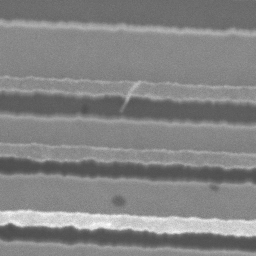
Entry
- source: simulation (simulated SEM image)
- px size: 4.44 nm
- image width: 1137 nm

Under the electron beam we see lines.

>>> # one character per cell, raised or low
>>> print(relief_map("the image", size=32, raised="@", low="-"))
--------------------------------
--------------------------------
--------------------------------
@@@@@@@@@@@@@@@@----------------
@@@@@@@@@@@@@@@@@@@@@@@@@@@@@@@@
@@@@@@@@@@@@@@@@@@@@@@@@@@@@@@@@
@@@@@@@@@@@@@@@@@@@@@@@@@@@@@@@@
@@@@@@@@@@@@@@@@@@@@@@@@@@@@@@@@
@@@@@@@@@@@@@@@@@@@@@@@@@@@@@@@@
@@@@@@@@@@@@@@@@@@@@@@@@@@@@@@@@
@@@@@@@@@@@@@@@@@@@@@@@@@@@@@@@@
---@--@@@@@@@@@@@@@@@@@@@@@@@@@@
----------------------@--@@@@@@@
--------------------------------
@@------------------------------
@@@@@@@@@@@@@@@@@@@@@@@@-@------
@@@@@@@@@@@@@@@@@@@@@@@@@@@@@@@@
@@@@@@@@@@@@@@@@@@@@@@@@@@@@@@@@
@@@@@@@@@@@@@@@@@@@@@@@@@@@@@@@@
@@@@@@@@@@@@@@@@@@@@@@@@@@@@@@@@
------------------@@@@@@@@@@@@@@
--------------------------------
@@@@@@@@@@@@@@@@@@--------------
@@@@@@@@@@@@@@@@@@@@@@@@@@@@@@@@
@@@@@@@@@@@@@@@@@@@@@@@@@@@@@@@@
@@@@@@@@@@@@@@@@@@@@@@@@@@@@@@@@
@@@@@@@@@@@@@@@@@@@@@@@@@@@@@@@@
@@@@@@@@@@@@@@@@@@@@@@@@@@@@@@@@
-----------@-@@@@@@@@@@@@@@@@@@@
--------------------------------
@@@@@@@@-@@@--------------------
@@@@@@@@@@@@@@@@@@@@@@@@@@@@@@@-